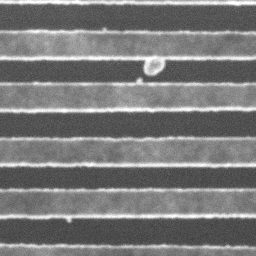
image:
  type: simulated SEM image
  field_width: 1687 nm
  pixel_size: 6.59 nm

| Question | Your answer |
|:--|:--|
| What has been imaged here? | lines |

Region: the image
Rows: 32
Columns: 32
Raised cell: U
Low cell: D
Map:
DDDDDDDDDDDDDDDDDDDDDDDDDDDDDDDD
DDDDDDDDDDDDDDDDDDDDDDDDDDDDDDDD
DDDDDDDDDDDDDDDDDDDDDDDDDDDDDDDD
DDDDDDDDDDDDDDDDDDDDDDDDDDDDDDDD
UUUUUUUUUUUUUUUUUUUUUUUUUUUUUUUU
UUUUUUUUUUUUUUUUUUUUUUUUUUUUUUUU
UUUUUUUUUUUUUUUUUUUUUUUUUUUUUUUU
DDDDDDDDDDDDDDDDDDUUUDDDDDDDDDDD
DDDDDDDDDDDDDDDDDDUUDDDDDDDDDDDD
DDDDDDDDDDDDDDDDDDDDDDDDDDDDDDDD
UUUUUUUUUUUUUUUUUUUUUUUUUUUUUUUU
UUUUUUUUUUUUUUUUUUUUUUUUUUUUUUUU
UUUUUUUUUUUUUUUUUUUUUUUUUUUUUUUU
UUUUUUUUUUUUUUUUUUUUUUUUUUUUUUUU
DDDDDDDDDDDDDDDDDDDDDDDDDDDDDDDD
DDDDDDDDDDDDDDDDDDDDDDDDDDDDDDDD
DDDDDDDDDDDDDDDDDDDDDDDDDDDDDDDD
UUUUUUUUUUUUUUUUUUUUUUUUUUUUUUUU
UUUUUUUUUUUUUUUUUUUUUUUUUUUUUUUU
UUUUUUUUUUUUUUUUUUUUUUUUUUUUUUUU
UUUUUUUUUUUUUUUUUUUUUUUUUUUUUUUU
DDDDDDDDDDDDDDDDDDDDDDDDDDDDDDDD
DDDDDDDDDDDDDDDDDDDDDDDDDDDDDDDD
DDDDDDDDDDDDDDDDDDDDDDDDDDDDDDDD
UUUUUUUUUUUUUUUUUUUUUUUUUUUUUUUU
UUUUUUUUUUUUUUUUUUUUUUUUUUUUUUUU
UUUUUUUUUUUUUUUUUUUUUUUUUUUUUUUU
DDDDDDDDDDDDDDDDDDDDDDDDDDDDDDDD
DDDDDDDDDDDDDDDDDDDDDDDDDDDDDDDD
DDDDDDDDDDDDDDDDDDDDDDDDDDDDDDDD
DDDDDDDDDDDDDDDDDDDDDDDDDDDDDDDD
UUUUUUUUUUUUUUUUUUUUUUUUUUUUUUUU